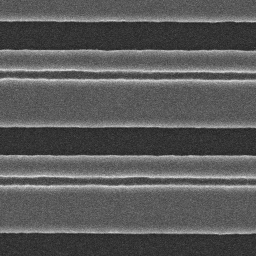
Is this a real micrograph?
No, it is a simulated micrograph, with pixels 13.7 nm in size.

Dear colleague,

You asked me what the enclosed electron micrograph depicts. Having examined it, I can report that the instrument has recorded lines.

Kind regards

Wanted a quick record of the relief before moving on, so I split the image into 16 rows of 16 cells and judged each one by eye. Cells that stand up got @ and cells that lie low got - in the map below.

@@@@@@@@@@@@@@@@
----------------
----------------
@@@@@@@@@@@@@@@@
@@@@@@@@@@@@@@@@
@@@@@@@@@@@@@@@@
@@@@@@@@@@@@@@@@
@@@@@@@@@@@@@@@@
----------------
----------------
@@@@@@@@@@@@@@@@
@@@@@@@@@@@@@@@@
@@@@@@@@@@@@@@@@
@@@@@@@@@@@@@@@@
---@-@@@@@@@@@@@
----------------